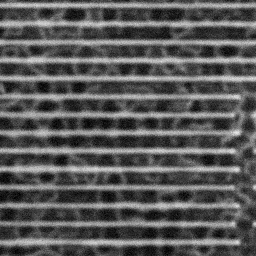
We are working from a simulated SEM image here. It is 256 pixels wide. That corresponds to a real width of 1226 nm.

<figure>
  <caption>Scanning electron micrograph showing parallel lines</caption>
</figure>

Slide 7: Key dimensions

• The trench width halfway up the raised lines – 70.6 nanometres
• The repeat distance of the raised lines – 0.0871 microns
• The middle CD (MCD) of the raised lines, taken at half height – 18.6 nm